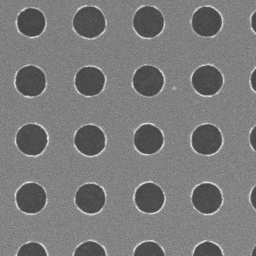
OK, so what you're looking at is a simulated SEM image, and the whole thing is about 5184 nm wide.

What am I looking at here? a regular array of holes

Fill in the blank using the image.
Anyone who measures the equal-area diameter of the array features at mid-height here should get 623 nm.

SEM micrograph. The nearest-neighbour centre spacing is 58.1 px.